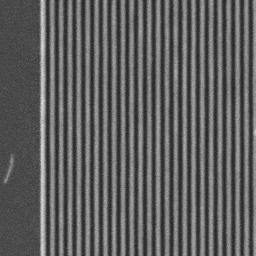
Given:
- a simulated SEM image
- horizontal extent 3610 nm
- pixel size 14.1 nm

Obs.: parallel lines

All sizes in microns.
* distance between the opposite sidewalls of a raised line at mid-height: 0.0476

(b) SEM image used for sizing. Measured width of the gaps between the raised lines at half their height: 5 pixels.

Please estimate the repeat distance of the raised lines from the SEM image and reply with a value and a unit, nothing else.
124 nm